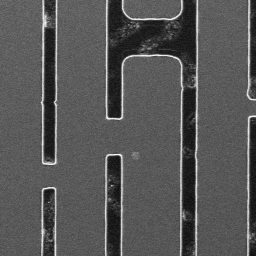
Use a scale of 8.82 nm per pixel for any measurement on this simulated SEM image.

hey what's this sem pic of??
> one or a few lines or trenches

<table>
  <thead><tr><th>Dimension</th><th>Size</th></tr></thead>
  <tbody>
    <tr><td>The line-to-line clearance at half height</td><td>51.2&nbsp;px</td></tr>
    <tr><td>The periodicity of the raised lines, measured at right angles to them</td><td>620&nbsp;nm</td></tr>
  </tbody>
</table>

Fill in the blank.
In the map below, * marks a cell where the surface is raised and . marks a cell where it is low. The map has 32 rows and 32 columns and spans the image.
.....**......**........**......*
.....**......***.......**......*
.....**......************......*
.....**......************......*
.....**......************......*
.....**......************......*
.....**......************......*
.....**......***......***......*
.....**......**........**......*
.....**......**........**......*
.....**......**........**......*
.....**......**........**......*
.....**......**........**.......
.....**......**........**.......
.....**......**........**.......
.....**................**......*
.....**................**......*
.....**................**......*
.....**................**......*
.....**......**........**......*
.............**........**......*
.............**........**......*
.............**........**......*
......*......**........**......*
.....**......**........**......*
.....**......**........**......*
.....**......**........**......*
.....**......**........*.......*
.....**......**........*.......*
.....**......**........*.......*
.....**......**........*.......*
.....**......**........*.......*